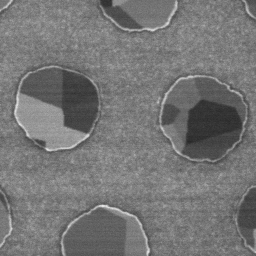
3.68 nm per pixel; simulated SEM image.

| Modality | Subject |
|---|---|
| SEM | raised bodies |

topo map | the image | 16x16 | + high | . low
......+++++....+
.......+++......
................
................
..+++...........
.+++++.....+++..
.+++++....+++++.
.+++++....+++++.
..+++.....+++++.
...........+++..
................
................
...............+
+....+++.......+
+...+++++......+
....+++++.......